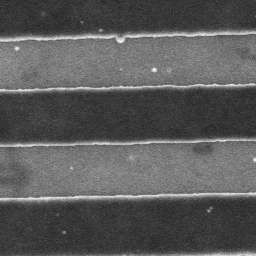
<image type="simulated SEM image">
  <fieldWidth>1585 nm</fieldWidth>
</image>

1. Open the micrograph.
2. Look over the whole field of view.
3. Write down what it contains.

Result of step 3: lines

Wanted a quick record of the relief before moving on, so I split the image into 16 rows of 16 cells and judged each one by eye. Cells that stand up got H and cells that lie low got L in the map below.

HHHHHHHHHHHHHHHH
HHHHHHHHHHHHHHHH
LLLLLLLLLLLLLLLL
LLLLLLLLLLLLLLLL
LLLLLLLLLLLLLLLL
LLLLHHHHHHHHHHHH
HHHHHHHHHHHHHHHH
HHHHHHHHHHHHHHHH
HHHHHHHHHHHHHHHH
LLLLLLLLLLLLLLLL
LLLLLLLLLLLLLLLL
LLLLLLLLLLLLLLLL
HHHHHHHHHHHHHHHH
HHHHHHHHHHHHHHHH
HHHHHHHHHHHHHHHH
HHHHHHHHHHHHHHHH